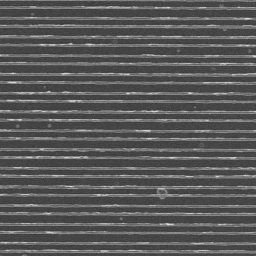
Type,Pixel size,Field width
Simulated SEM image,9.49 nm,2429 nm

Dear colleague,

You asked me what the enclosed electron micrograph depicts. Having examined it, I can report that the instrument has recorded parallel lines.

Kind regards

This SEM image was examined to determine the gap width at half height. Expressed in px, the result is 6.12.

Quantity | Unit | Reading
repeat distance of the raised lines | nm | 88.9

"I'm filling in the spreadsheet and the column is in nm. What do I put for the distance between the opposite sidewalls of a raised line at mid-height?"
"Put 22.5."